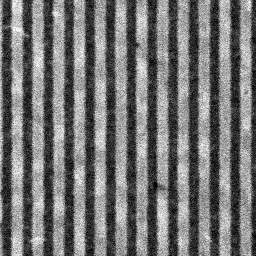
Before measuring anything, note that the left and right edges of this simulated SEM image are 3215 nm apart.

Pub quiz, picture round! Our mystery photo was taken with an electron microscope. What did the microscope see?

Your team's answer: parallel lines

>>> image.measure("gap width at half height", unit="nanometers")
138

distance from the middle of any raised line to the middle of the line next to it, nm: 261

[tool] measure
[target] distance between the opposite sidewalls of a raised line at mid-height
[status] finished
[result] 0.121 um